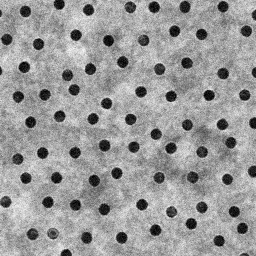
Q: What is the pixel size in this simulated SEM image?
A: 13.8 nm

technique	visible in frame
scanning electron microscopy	a regular array of holes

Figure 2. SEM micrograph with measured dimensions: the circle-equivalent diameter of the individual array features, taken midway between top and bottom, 12.4 pixels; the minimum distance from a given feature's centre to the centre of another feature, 358 nanometers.